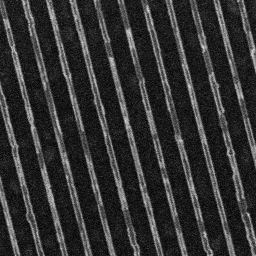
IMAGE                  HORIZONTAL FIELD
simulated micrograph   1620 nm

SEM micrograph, parallel lines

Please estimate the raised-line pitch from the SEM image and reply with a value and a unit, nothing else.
147 nm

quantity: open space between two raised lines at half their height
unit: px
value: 17.7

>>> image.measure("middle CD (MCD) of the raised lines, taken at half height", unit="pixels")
4.98